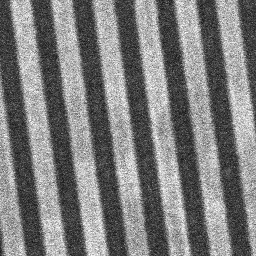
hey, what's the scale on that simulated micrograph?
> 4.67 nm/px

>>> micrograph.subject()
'parallel lines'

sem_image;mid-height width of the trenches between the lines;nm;104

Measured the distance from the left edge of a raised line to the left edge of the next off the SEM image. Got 191 nm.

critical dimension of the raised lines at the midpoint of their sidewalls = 87.8 nanometres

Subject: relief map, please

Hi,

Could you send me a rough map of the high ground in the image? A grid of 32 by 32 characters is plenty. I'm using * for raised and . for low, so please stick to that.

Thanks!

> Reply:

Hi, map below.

.***...**...**...**...**...***..
..**...**...**...***..**...***..
..**...**...**...***..***..***..
..**...**...***..***..***...**..
..**...**...***..***...**...**..
..**...***..***...**...**...**..
..***..***...**...**...**...**..
..***...**...**...**...**...***.
...**...**...**...**...**...***.
...**...**...**...***..***..***.
...**...**...***..***..***...**.
...**...**...***..***...**...**.
...**...***..***...**...**...**.
...***..***...**...**...**...**.
*..***...**...**...**...**...***
*...**...**...**...**...**...***
*...**...**...**...**...***..***
*...**...**...***..***..***...**
*...**...**...***..***...**...**
*...**...***..***...**...**...**
*...***..***...**...**...**...**
**..***...**...**...**...**...**
**...**...**...**...**...**...**
**...**...**...**...**...***..**
**...**...**...***..***..***...*
**...**...**...***..***...**...*
**...**...***..***...**...**...*
**...***..***...**...**...**...*
***..***...**...**...**...**...*
***...**...**...**...**...**...*
***...**...**...**...**...***..*
.**...**...**...**...***..***...